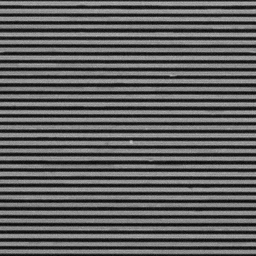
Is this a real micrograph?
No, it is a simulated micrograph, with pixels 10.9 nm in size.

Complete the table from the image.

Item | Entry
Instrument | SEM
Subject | parallel lines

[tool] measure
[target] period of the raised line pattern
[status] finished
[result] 84.9 nanometers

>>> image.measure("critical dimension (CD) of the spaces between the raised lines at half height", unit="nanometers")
41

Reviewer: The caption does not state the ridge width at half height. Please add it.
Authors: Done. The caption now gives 0.041 microns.